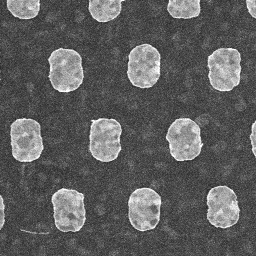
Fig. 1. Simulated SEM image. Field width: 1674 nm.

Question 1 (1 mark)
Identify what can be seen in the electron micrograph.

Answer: a regular array of raised bodies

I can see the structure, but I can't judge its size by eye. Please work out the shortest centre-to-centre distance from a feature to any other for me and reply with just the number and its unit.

513 nm